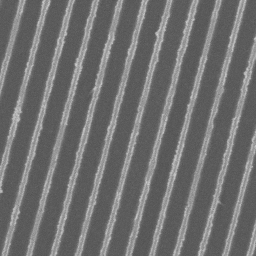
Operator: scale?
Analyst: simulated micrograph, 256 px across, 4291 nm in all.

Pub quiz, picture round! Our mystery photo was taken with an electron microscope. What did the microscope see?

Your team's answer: parallel lines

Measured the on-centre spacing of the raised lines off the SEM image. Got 23.7 px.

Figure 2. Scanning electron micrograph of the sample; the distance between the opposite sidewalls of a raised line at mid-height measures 130 nanometres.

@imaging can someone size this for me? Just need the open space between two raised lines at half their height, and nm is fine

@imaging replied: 276